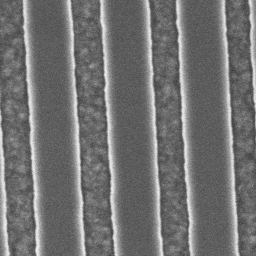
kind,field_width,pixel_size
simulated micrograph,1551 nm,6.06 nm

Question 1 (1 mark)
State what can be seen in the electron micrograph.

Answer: lines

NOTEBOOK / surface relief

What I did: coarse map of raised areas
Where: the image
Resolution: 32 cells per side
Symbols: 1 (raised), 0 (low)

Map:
00011111100001111110001111110001
00011111100001111110001111110001
00011111100001111110001111110001
00011111100001111110001111110001
00011111100001111110001111110001
00011111100001111110001111110001
00011111100001111110001111110001
00011111100001111110001111110001
00011111100001111110000111110000
00011111100001111110000111111000
00011111100001111110000111111000
00001111100001111110000111111000
00001111110001111110000111111000
00001111110001111110000111111000
00001111110001111110000111111000
00001111110001111110000111111000
00001111110000111110000111111000
00001111110000111111000111111000
00001111110000111111000111111000
00001111110000111111000111111000
00001111110000111111000111111000
00001111110000111111000111111000
00001111110000111111000111111000
10001111110000111111000111111000
10001111110000111111000111111000
10001111110000111111000011111000
10001111110000111111000011111000
10001111110000111111000011111100
10000111110000111111000011111100
10000111110000111111000011111100
10000111111000111111000011111100
10000111111000111111000011111100